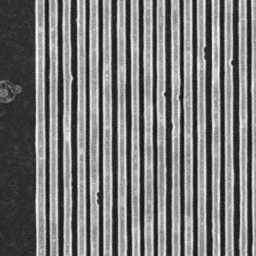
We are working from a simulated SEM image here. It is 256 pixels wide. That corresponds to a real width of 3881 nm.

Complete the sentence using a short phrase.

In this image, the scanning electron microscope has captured parallel lines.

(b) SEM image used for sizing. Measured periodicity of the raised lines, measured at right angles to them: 205 nm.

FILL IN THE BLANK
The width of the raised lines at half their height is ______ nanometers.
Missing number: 106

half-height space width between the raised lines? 94.7 nanometres